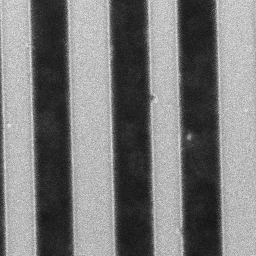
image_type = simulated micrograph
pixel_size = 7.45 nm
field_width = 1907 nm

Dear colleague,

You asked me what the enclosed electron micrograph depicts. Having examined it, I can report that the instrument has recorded one or a few lines or trenches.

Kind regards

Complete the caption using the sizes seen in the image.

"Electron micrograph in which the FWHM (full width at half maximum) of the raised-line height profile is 308 nanometers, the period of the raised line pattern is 73.8 px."